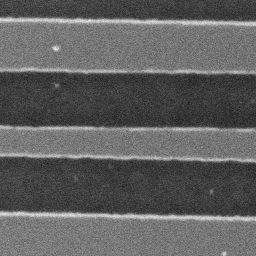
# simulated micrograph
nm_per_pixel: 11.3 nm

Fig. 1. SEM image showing lines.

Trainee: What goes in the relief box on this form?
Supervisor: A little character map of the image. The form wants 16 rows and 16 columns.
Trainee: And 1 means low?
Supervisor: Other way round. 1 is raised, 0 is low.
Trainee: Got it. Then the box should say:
0000000000000000
1111111111111111
1111111111111111
1111111111111111
0000000000101111
0000000000000000
0000000000000000
0000000000000000
1111111111111111
1111111111111111
0000000000000000
0000000000000000
0000000000000000
1111111110000000
1111111111111111
1111111111111111